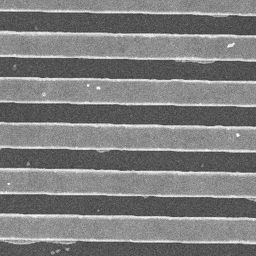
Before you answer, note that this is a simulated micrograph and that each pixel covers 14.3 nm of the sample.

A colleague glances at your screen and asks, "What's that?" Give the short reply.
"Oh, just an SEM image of lines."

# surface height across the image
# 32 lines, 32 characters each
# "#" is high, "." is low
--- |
################################
...........#####################
................................
................................
##############################..
################################
################################
.......................#########
................................
................................
################################
################################
################################
................................
................................
#########.......................
################################
################################
.###############################
................................
................................
#######################.........
################################
################################
...................#############
................................
................................
################################
################################
################################
................................
................................